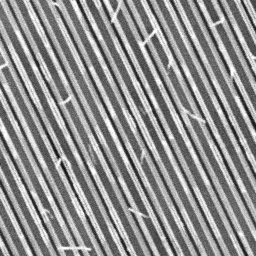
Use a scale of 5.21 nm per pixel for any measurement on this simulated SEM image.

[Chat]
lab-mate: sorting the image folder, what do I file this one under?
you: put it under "parallel lines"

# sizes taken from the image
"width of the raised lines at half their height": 19.4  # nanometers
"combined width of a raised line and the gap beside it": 55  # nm